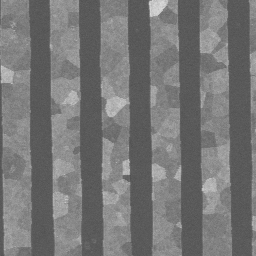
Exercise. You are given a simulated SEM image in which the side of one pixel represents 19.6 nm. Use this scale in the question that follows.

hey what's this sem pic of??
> wiring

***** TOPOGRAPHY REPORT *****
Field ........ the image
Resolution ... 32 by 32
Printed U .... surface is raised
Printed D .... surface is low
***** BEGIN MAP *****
UUUUDDUUUUDDDUUUDDDUUUDDDUUUDDDU
UUUUDDUUUUDDDUUUDDDUUUDDDUUUDDDU
UUUUDDUUUUDDDUUUDDDUUUDDDUUUDDDU
UUUUDDUUUUDDDUUUDDDUUUDDDUUUDDDU
UUUUDDUUUUDDDUUUDDDUUUDDDUUUDDDU
UUUUDDUUUUDDDUUUDDDUUUDDDUUUDDDU
UUUUDDUUUUDDDUUUDDDUUUDDDUUUDDDU
UUUUDDUUUUDDDUUUDDDUUUDDDUUUDDDU
UUUUDDUUUUDDDUUUDDDUUUDDDUUUDDDU
UUUUDDUUUUDDDUUUDDDUUUDDDUUUUDDU
UUUUDDUUUUDDDUUUDDDUUUDDDUUUUDDU
UUUUDDUUUUDDDUUUDDDUUUDDDUUUUDDU
UUUUDDUUUUDDDUUUDDDUUUDDDUUUUDDU
UUUUDDUUUUDDDUUUDDDUUUDDDUUUUDDU
UUUUDDDUUUDDDUUUDDDUUUDDDUUUUDDU
UUUUDDDUUUDDDUUUDDDUUUDDDUUUUDDU
UUUUDDDUUUDDDUUUDDDUUUDDDUUUUDDU
UUUUDDDUUUDDDUUUDDDUUUDDDUUUUDDD
UUUUDDDUUUDDDUUUDDDUUUUDDUUUUDDD
UUUUDDDUUUDDDUUUDDDUUUUDDUUUUDDD
UUUUDDDUUUDDDUUUDDDUUUUDDUUUUDDD
UUUUDDDUUUDDDUUUDDDUUUUDDUUUUDDD
UUUUDDDUUUDDDUUUDDDUUUUDDUUUUDDD
UUUUDDDUUUDDDUUUDDDUUUUDDUUUUDDD
DUUUDDDUUUDDDUUUDDDUUUUDDUUUUDDD
DUUUDDDUUUDDDUUUDDDUUUUDDUUUUDDD
DUUUDDDUUUDDDUUUDDDUUUUDDUUUUDDD
DUUUDDDUUUDDDUUUDDDUUUUDDUUUUDDD
DUUUDDDUUUDDDUUUDDDUUUUDDUUUUDDD
DUUUDDDUUUDDDUUUDDDUUUUDDUUUUDDD
DUUUDDDUUUDDDUUUDDDUUUUDDUUUUDDD
DUUUDDDUUUDDDUUUDDDUUUUDDUUUUDDD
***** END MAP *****